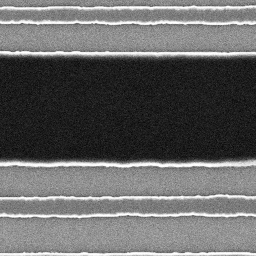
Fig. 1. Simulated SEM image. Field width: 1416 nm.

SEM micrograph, lines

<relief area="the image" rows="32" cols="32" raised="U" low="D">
DDDDDDDDDDDDDDDDDDDDDDDDDDDDDDDD
UUUUUUUUUUUUUUUUUUUUUUUUUUUUUUUU
UUUUUUUUUUUUUUUUUUUUUUUUUUUUUUUU
DDDDDDDDDDDDDDDDDDDDDDDDDDDDDDDD
DDDDDDDDDDDDDDDDDDDDDDDDDDDDDDDD
DDDDDDDDDDDDDDDDDDDDDDDDDDDDDDDD
UUUUDDDDDUDDDDDDDDDDDDDDDDDDDDDD
UUUUUUUUUUUUUUUUUUUUUUUUUUUUUUUU
UUUUUUUUUUUUUUUUUUUUUUUUUUUUUUUU
UUUUUUUUUUUUUUUUUUUUUUUUUUUUUUUU
UUUUUUUUUUUUUUUUUUUUUUUUUUUUUUUU
UUUUUUUUUUUUUUUUUUUUUUUUUUUUUUUU
UUUUUUUUUUUUUUUUUUUUUUUUUUUUUUUU
UUUUUUUUUUUUUUUUUUUUUUUUUUUUUUUU
UUUUUUUUUUUUUUUUUUUUUUUUUUUUUUUU
UUUUUUUUUUUUUUUUUUUUUUUUUUUUUUUU
UUUUUUUUUUUUUUUUUUUUUUUUUUUUUUUU
UUUUUUUUUUUUUUUUUUUUUUUUUUUUUUUU
UUUUUUUUUUUUUUUUUUUUUUUUUUUUUUUU
UUUUUUUUUUUUUUUUUUUUUUUUUUUUUUUU
UUUUUUUUUUUUUUUUUUUUUUUUUUUUUUUD
DDDDDDDDDDDDDDDDDDDDDDDDDDDDDDDD
DDDDDDDDDDDDDDDDDDDDDDDDDDDDDDDD
DDDDDDDDDDDDDDDDDDDDDDDDDDDDDDDD
DDDDDDDDDDDDDDDDDDDDDDDDDDDUUDDD
UUUUUUUUUUUUUUUUUUUUUUUUUUUUUUUU
UUUUUUUUUUUUUUUUUUUUUUUUUUUUUUUU
DDDDDDDDDDDDDDDDDDDDDDDDDDDDDDDD
DDDDDDDDDDDDDDDDDDDDDDDDDDDDDDDD
DDDDDDDDDDDDDDDDDDDDDDDDDDDDDDDD
DDDDDDDDDDDDDDDDDDDDDDDDDDDDDDDD
DDDDDDDDDDDDDDDDDDDDDDDDDDDDDDDD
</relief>